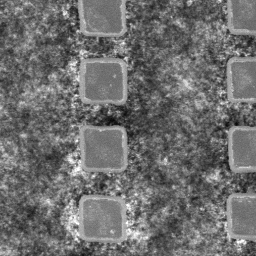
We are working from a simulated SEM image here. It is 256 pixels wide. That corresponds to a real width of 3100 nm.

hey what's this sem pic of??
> raised bodies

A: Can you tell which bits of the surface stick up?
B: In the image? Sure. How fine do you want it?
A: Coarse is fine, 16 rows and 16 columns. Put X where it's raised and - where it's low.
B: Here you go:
-----XXX------XX
-----XXX------XX
----------------
----------------
-----XXX------XX
-----XXX------XX
----------------
----------------
-----XXX------XX
-----XXX------XX
-----XXX-------X
----------------
-----XX-------XX
-----XXX------XX
-----XXX------XX
----------------